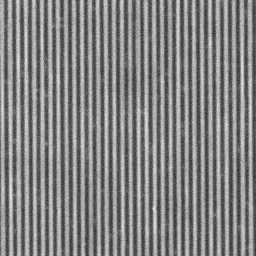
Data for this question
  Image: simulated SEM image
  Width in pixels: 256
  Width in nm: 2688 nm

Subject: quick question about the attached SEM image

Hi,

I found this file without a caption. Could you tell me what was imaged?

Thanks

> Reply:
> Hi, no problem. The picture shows parallel lines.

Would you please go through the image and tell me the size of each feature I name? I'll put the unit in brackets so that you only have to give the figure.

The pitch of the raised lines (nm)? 84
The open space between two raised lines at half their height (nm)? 55.1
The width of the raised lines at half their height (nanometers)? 27.6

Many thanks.